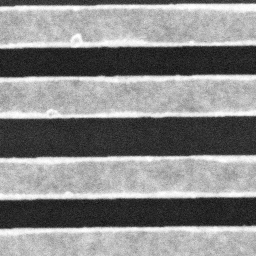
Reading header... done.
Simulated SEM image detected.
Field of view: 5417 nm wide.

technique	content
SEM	lines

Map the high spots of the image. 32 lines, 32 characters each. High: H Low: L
LLLLLLLLLLLLLLLLLLLLLLLLLLLLLLLL
HHHHHHHHHHHHHHHHHHHHHHHHHHHHHHHH
HHHHHHHHHHHHHHHHHHHHHHHHHHHHHHHH
HHHHHHHHHHHHHHHHHHHHHHHHHHHHHHHH
HHHHHHHHHHHHHHHHHHHHHHHHHHHHHHHH
HHHHHHHHHHHHHHHHHHHHHHHHHHHHHHHH
LLLLLLLLLLLLLLLLLLLLLLLLLLLLLLLL
LLLLLLLLLLLLLLLLLLLLLLLLLLLLLLLL
LLLLLLLLLLLLLLLLLLLLLLLLLLLLLLLL
LLLLLLLLLLLLLLLLLLLLLLLLLLLHHHHH
HHHHHHHHHHHHHHHHHHHHHHHHHHHHHHHH
HHHHHHHHHHHHHHHHHHHHHHHHHHHHHHHH
HHHHHHHHHHHHHHHHHHHHHHHHHHHHHHHH
HHHHHHHHHHHHHHHHHHHHHHHHHHHHHHHH
HHHHHHHHHHHHHHHHHHHHHHHHHHLLLLLL
LLLLLLLLLLLLLLLLLLLLLLLLLLLLLLLL
LLLLLLLLLLLLLLLLLLLLLLLLLLLLLLLL
LLLLLLLLLLLLLLLLLLLLLLLLLLLLLLLL
LLLLLLLLLLLLLLLLLLLLLLLLLLLLLLLL
LLLLLLLLLLLLLLLLLLLLLLLLLLLLLLLL
HHHHHHHHHHHHHHHHHHHHHHHHHHHHHHHH
HHHHHHHHHHHHHHHHHHHHHHHHHHHHHHHH
HHHHHHHHHHHHHHHHHHHHHHHHHHHHHHHH
HHHHHHHHHHHHHHHHHHHHHHHHHHHHHHHH
HHHHHHHHHHHHHHHHHHHHHHHHHHHHHHLL
LLLLLLLLLLLLLLLLLLLLLLLLLLLLLLLL
LLLLLLLLLLLLLLLLLLLLLLLLLLLLLLLL
LLLLLLLLLLLLLLLLLLLLLLLLLLLLLLLL
LLLLLLLLLLLLLLHHHHHHHHHHHHHHHHHH
HHHHHHHHHHHHHHHHHHHHHHHHHHHHHHHH
HHHHHHHHHHHHHHHHHHHHHHHHHHHHHHHH
HHHHHHHHHHHHHHHHHHHHHHHHHHHHHHHH